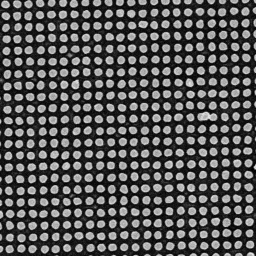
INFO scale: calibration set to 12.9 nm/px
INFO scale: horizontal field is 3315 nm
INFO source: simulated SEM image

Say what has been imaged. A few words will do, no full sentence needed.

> a regular array of raised bodies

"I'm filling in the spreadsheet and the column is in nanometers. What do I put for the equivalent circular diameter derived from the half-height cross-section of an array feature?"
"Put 99.1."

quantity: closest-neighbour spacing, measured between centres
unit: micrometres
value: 0.143